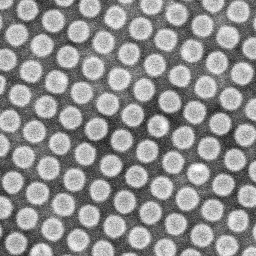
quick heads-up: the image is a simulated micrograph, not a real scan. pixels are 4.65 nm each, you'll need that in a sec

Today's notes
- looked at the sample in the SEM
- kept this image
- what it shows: a regular array of raised bodies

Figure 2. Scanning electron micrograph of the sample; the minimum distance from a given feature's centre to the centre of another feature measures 0.127 micrometres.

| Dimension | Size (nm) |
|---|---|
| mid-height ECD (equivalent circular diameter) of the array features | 93.9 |